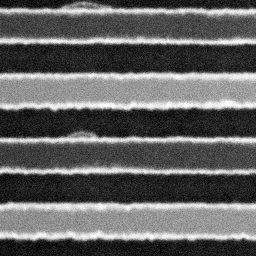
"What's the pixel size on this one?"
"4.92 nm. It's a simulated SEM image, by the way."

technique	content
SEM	lines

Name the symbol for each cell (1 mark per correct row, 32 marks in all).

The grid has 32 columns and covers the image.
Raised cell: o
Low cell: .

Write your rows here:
................................
oooooooooooooooooooooooooooooooo
oooooooooooooooooooooooooooooooo
oooooooooooooooooooooooooooooooo
oooooooooooooooooooooooooooooooo
................................
................................
................................
................................
oooooooooooooooooooooooooooooooo
oooooooooooooooooooooooooooooooo
oooooooooooooooooooooooooooooooo
oooooooooooooooooooooooooooooooo
ooo...oo.......oo.o.o...........
................................
................................
................................
oooooooooooooooooooooooooooooooo
oooooooooooooooooooooooooooooooo
oooooooooooooooooooooooooooooooo
oooooooooooooooooooooooooooooooo
ooooooooooo.oo..oooooooooooooooo
................................
................................
................................
.o..............................
oooooooooooooooooooooooooooooooo
oooooooooooooooooooooooooooooooo
oooooooooooooooooooooooooooooooo
oooooooooooooooooooooooooooooooo
................................
................................